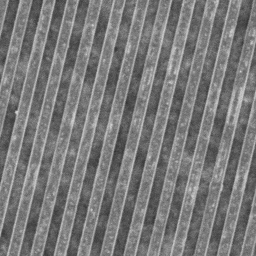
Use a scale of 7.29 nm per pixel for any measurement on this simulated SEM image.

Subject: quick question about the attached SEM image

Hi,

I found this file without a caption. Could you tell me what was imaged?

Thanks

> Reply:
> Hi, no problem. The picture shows parallel lines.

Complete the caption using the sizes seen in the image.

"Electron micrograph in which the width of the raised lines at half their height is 78.1 nm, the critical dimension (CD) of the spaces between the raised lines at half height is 11.7 px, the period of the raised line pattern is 22.7 pixels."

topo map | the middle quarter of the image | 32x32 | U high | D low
DDDUUUDDDUUDDDDUUDDDUUUDDDUUUDDD
DDDUUDDDDUUDDDUUUDDDUUUDDDUUUDDD
DDUUUDDDUUUDDDUUUDDDUUDDDDUUDDDU
DDUDUDDDUUUDDDUUDDDDUUDDDUUUDDDU
DDUUUDDDUUUDDDUUDDDUUUDDDUUUDDDU
DDUUUDDDUUDDDUUUDDDUUUDDDUUUDDDU
DUUUDDDUUUDDDUUUDDDUUUDDDUUDDDDU
DUUUDDDUUUDDDUUUDDDUUDDDUUUDDDUU
DUUUDDDUUUDDDUUDDDUUUDDDUUUDDDUU
DUUUDDDUUDDDUUUDDDUUUDDDUUUDDDUU
UUUDDDUUUDDDUUUDDDUUUDDDUUUDDDUU
UUUDDDUUUDDDUUUDDDUUDDDUUUDDDUUU
UDUDDDUUUDDDUUDDDUUUDDDUUUDDDUUU
DDUDDDUUDDDUUUDDDUUUDDDUUUDDDUUU
UDDDDDUUDDDUUUDDDUUUDDDUUUDDDUUD
UUDDDUUUDDDUUUDDDUUDDDUUUDDDUUUD
UUDDDUUUDDDUUDDDUUUDDDUUUDDDUUUD
UUDDDUUDDDDUUDDDUUUDDDUUUDDDUUUD
UUDDDUUDDDUUUDDDUUUDDDUUUDDDUUDD
UDDDUUUDDDUUUDDDUUDDDDUUDDDUUUDD
UDDDUUUDDDUUUDDDUUDDDUUUDDDUUUDD
UDDDUUUDDDUUDDDUUUDDDUUUDDDUUUDD
UDDDUUDDDUUUDDDUUUDDDUUUDDDUUDDD
DDDUUUDDDUUUDDDUUUDDDUUUDDDUUDDD
DDDUUUDDDUUUDDDUUDDDUUUDDDUUUDDD
DDDUUUDDDUUDDDUUUDDDUUUDDDUUUDDD
DDDUUDDDUUUDDDUUUDDDUUUDDDUUUDDD
DDUUUDDDUUUDDDUUUDDDUUUDDDUUDDDU
DDUUUDDDUUUDDDUUDDDUUUDDDUUUDDDU
DDUUUDDDUUDDDUUUDDDUUUDDDUUUDDDU
DDUUDDDUUUDDDUUUDDDUUUDDDUUUDDDU
DDUUDDDUUUDDDUUUDDDUUUDDDUUDDDDU